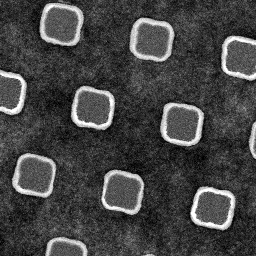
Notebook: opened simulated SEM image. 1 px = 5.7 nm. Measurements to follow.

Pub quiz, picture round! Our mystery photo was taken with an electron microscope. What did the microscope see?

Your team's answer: raised bodies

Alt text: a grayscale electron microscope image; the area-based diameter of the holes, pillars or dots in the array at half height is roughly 237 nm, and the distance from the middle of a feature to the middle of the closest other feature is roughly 509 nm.